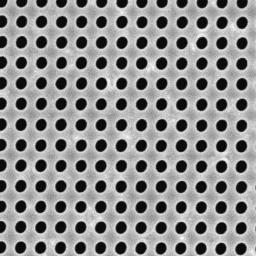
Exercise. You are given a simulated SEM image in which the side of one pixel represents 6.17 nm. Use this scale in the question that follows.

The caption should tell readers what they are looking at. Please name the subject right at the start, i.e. a regular array of holes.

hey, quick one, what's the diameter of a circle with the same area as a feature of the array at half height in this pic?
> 72.7 nanometers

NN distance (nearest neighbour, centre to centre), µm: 0.123